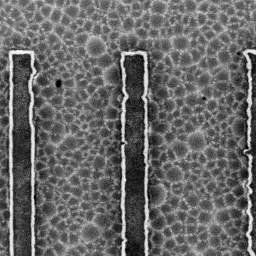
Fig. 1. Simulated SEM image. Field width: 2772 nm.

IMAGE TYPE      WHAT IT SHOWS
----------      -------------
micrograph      one or a few lines or trenches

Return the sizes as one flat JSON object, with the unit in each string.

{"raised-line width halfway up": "22.1 pixels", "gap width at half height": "1100 nanometres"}